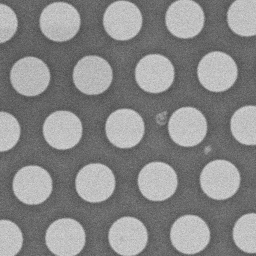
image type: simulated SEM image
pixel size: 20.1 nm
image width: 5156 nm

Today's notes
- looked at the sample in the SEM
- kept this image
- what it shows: an array of small figures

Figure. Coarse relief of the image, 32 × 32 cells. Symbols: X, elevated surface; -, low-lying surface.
-------X------XXX-----XXX----XXX
XX---XXXXX---XXXX----XXXX----XXX
XX---XXXXX---XXXXX---XXXX----XXX
XX---XXXXX---XXXXX---XXXX----XXX
XX----XXX-----XXX-----XX--------
--------------------------------
--------------------------------
---XX-----XXX-----XXX----XXXX---
--XXXX---XXXXX---XXXXX---XXXXX--
-XXXXX---XXXXX---XXXXX---XXXXX--
--XXXX---XXXXX---XXXX----XXXX---
--XXX-----XXX------X------------
--------------------------------
-----------------------X------XX
X-----XXX-----XXX-----XXX----XXX
XX----XXXX---XXXXX---XXXXX---XXX
XX---XXXXX---XXXXX---XXXXX---XXX
XX----XXXX----XXX-----XXX-----XX
X------XX-----------------------
--------------------------------
-------------------XX-----XXX---
--XXXX----XXXX----XXXX---XXXXX--
--XXXX----XXXX---XXXXX---XXXXX--
--XXXX----XXXX---XXXXX---XXXXX--
--XXXX----XXXX----XXX-----XXX---
--------------------------------
--------------------------------
-------XX------XX-----XXX-----XX
XX----XXXX----XXXX----XXXX---XXX
XXX---XXXXX---XXXX---XXXXX---XXX
XXX---XXXX----XXXX----XXXX----XX
XX-----XXX-----XX------XX------X